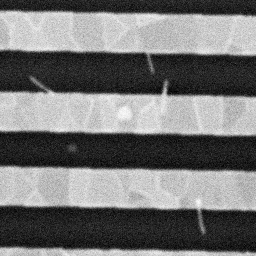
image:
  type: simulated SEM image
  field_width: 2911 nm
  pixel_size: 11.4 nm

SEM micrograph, lines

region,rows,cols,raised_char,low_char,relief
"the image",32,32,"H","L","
LLLLLLLLLLLLLLLLLLLLLLLLLLLLLLLL
LLLLLLLLLLLLLLLLLLLLLLLLLLLLLLLL
HHHHHHHHHHHHHHHHHHHHHHHHHHHHHHHH
HHHHHHHHHHHHHHHHHHHHHHHHHHHHHHHH
HHHHHHHHHHHHHHHHHHHHHHHHHHHHHHHH
HHHHHHHHHHHHHHHHHHHHHHHHHHHHHHHH
LLLLLLLLLLLLLLLLLLHHHHHHHHHHHHHH
LLLLLLLLLLLLLLLLLLLLLLLLLLLLLLLL
LLLLLLLLLLLLLLLLLLLLLLLLLLLLLLLL
LLLLLLLLLLLLLLLLLLLLLLLLLLLLLLLL
LLLLLLLLLLLLLLLLLLLLLLLLLLLLLLLL
LLLLLLLLLLLLLLLLLLLLLLLLLLLLLLLL
HHHHHHHHHHHHHHHHHHHHHHHHHHHHHHHH
HHHHHHHHHHHHHHHHHHHHHHHHHHHHHHHH
HHHHHHHHHHHHHHHHHHHHHHHHHHHHHHHH
HHHHHHHHHHHHHHHHHHHHHHHHHHHHHHHH
LLLLLLLLLLLLLLLLLHHHHHHHHHHHHHHH
LLLLLLLLLLLLLLLLLLLLLLLLLLLLLLLL
LLLLLLLLLLLLLLLLLLLLLLLLLLLLLLLL
LLLLLLLLLLLLLLLLLLLLLLLLLLLLLLLL
LLLLLLLLLLLLLLLLLLLLLLLLLLLLLLLL
HHHHHHHHHHHHHHHHHHHHHHHHHHHHHHHL
HHHHHHHHHHHHHHHHHHHHHHHHHHHHHHHH
HHHHHHHHHHHHHHHHHHHHHHHHHHHHHHHH
HHHHHHHHHHHHHHHHHHHHHHHHHHHHHHHH
HHHHHHHHHHHHHHHHHHHHHHHHHHHHHHHH
LLLLLLLLLLLLLLLLLLLLLLLLLLLLLLLL
LLLLLLLLLLLLLLLLLLLLLLLLLLLLLLLL
LLLLLLLLLLLLLLLLLLLLLLLLLLLLLLLL
LLLLLLLLLLLLLLLLLLLLLLLLLLLLLLLL
LLLLLLLLLLLLLLLLLLLLLLLLLLLLLLLL
HHHHHHHHHHHHHHHHHHHHLLLLLLLLLLLL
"